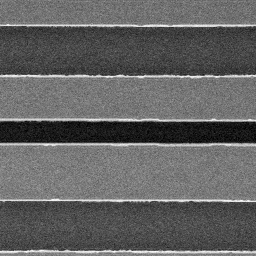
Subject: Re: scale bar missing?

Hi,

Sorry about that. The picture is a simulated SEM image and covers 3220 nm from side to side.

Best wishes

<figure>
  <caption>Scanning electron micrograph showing lines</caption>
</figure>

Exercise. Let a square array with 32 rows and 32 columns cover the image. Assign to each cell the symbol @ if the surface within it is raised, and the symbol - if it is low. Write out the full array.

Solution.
@@@@@@@@@@@@@@@@@@@@@@@@@@@@@@@@
@@@@@@@@@@@@@@@@@@@@@@@@@@@@@@@@
@@@@@@@@@@@@@@@@@@@@@@@@@@@@@@@@
--------------------------------
--------------------------------
--------------------------------
--------------------------------
--------------------------------
--------------------------------
@-@@---------------------------@
@@@@@@@@@@@@@@@@@@@@@@@@@@@@@@@@
@@@@@@@@@@@@@@@@@@@@@@@@@@@@@@@@
@@@@@@@@@@@@@@@@@@@@@@@@@@@@@@@@
@@@@@@@@@@@@@@@@@@@@@@@@@@@@@@@@
@@@@@@@@@@@@@@@@@@@@@@@@@@@@@@@@
--------------------------------
--------------------------------
--------------------------------
@@@@@@@@@@@@@@@@@@@@@@@@@@@@@@@@
@@@@@@@@@@@@@@@@@@@@@@@@@@@@@@@@
@@@@@@@@@@@@@@@@@@@@@@@@@@@@@@@@
@@@@@@@@@@@@@@@@@@@@@@@@@@@@@@@@
@@@@@@@@@@@@@@@@@@@@@@@@@@@@@@@@
@@@@@@@@@@@@@@@@@@@@@@@@@@@@@@@@
@@@@@@@@@@@@@@@@@@@@@@@@@@@@@@@@
--------------------------------
--------------------------------
--------------------------------
--------------------------------
--------------------------------
--------------------------------
-@@@@@@@@@-@@@@@@-@@-------@@@--